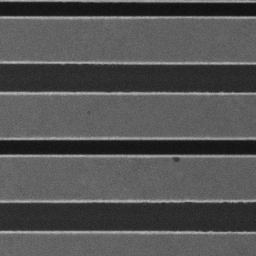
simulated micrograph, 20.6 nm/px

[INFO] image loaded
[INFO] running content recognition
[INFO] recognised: lines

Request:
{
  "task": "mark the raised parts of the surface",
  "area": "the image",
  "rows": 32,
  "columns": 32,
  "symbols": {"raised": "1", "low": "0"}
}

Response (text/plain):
00000000000000000000000000000000
00000000000000000000000000000000
11111111111111111111111111111111
11111111111111111111111111111111
11111111111111111111111111111111
11111111111111111111111111111111
11111111111111111111111111111111
11111111111111111111111111111111
00000000000000000000000000000000
00000000000000000000000000000000
00000000000000000000000000000000
00000000000000000000000000000000
11111111111111111111111111111111
11111111111111111111111111111111
11111111111111111111111111111111
11111111111111111111111111111111
11111111111111111111111111111111
00000000000000000000000000000000
00000000000000000000000000000000
11111111111111111111111111111111
11111111111111111111111111111111
11111111111111111111111111111111
11111111111111111111111111111111
11111111111111111111111111111111
11111111111111111111111111111111
00000000000000000000000000000000
00000000000000000000000000000000
00000000000000000000000000000000
00000000000000000000000000000000
11111111111111111111111111111111
11111111111111111111111111111111
11111111111111111111111111111111